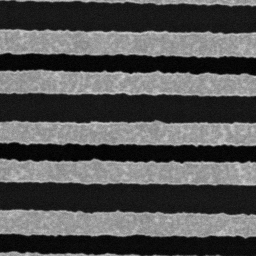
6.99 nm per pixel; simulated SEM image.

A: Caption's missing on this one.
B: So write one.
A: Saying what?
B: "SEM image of lines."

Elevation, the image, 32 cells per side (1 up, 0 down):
00000000000000000000000011111111
00000000000000000000000000000000
00000000000000000000000000000000
00000000000000000000000000000000
11111111111111111111111111111111
11111111111111111111111111111111
11111111111111111111111111111111
00000000000000000000000000000000
00000000000000000000000000000000
11111111111111111111111111111111
11111111111111111111111111111111
11111111111111111111111111111111
00000000000000000000000000000000
00000000000000000000000000000000
00000000000000000000000000000000
11111111111111111111111111111111
11111111111111111111111111111111
11111111111111111111111111111111
00000000000000000000000000000000
00000000000000000000000000000000
11111111111111111111111111111111
11111111111111111111111111111111
11111111111111111111111111111111
00000000000000000000000000000000
00000000000000000000000000000000
00000000000000000000000000000000
11111111110000100000000000000000
11111111111111111111111111111111
11111111111111111111111111111111
00000000000100110001110111010111
00000000000000000000000000000000
00000000000000000000000000000000